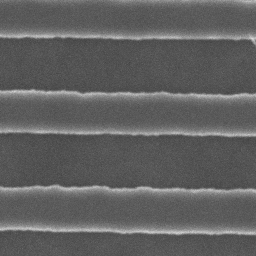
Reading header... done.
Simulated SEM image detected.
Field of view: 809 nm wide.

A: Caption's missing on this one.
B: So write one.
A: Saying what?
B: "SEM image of lines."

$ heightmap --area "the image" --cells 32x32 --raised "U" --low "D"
UUUUUUUUUUUUUUUUUUUUUUUUUUUUUUUU
UUUUUUUUUUUUUUUUUUUUUUUUUUUUUUUU
UUUUUUUUUUUUUUUUUUUUUUUUUUUUUUUU
UUUUUUUUUUUUUUUUUUUUUUUUUUUUUUUU
UUUUUUUUUUUUUUUUUUUUUUUUUUUUUUUU
DDDDDDDDDDDDDDDDDDDDDDDDDDDDDDDD
DDDDDDDDDDDDDDDDDDDDDDDDDDDDDDDD
DDDDDDDDDDDDDDDDDDDDDDDDDDDDDDDD
DDDDDDDDDDDDDDDDDDDDDDDDDDDDDDDD
DDDDDDDDDDDDDDDDDDDDDDDDDDDDDDDD
DDDDDDDDDDDDDDDDDDDDDDDDDDDDDDDD
UUUUUUUUUUDDDDDDDDDDUDDDDDDDDDDD
UUUUUUUUUUUUUUUUUUUUUUUUUUUUUUUU
UUUUUUUUUUUUUUUUUUUUUUUUUUUUUUUU
UUUUUUUUUUUUUUUUUUUUUUUUUUUUUUUU
UUUUUUUUUUUUUUUUUUUUUUUUUUUUUUUU
UDDDUUUUUUUUUUUUUUUUUUUUUUUUUUUU
DDDDDDDDDDDDDDDDDDDDDDDDDDDDDDDD
DDDDDDDDDDDDDDDDDDDDDDDDDDDDDDDD
DDDDDDDDDDDDDDDDDDDDDDDDDDDDDDDD
DDDDDDDDDDDDDDDDDDDDDDDDDDDDDDDD
DDDDDDDDDDDDDDDDDDDDDDDDDDDDDDDD
DDDDDDDDDDDDDDDDDDDDDDDDDDDDDDDD
UDDUUUUUDUUUUUDDDUUDDDDDDDDDDDDD
UUUUUUUUUUUUUUUUUUUUUUUUUUUUUUUU
UUUUUUUUUUUUUUUUUUUUUUUUUUUUUUUU
UUUUUUUUUUUUUUUUUUUUUUUUUUUUUUUU
UUUUUUUUUUUUUUUUUUUUUUUUUUUUUUUU
UUUUUUUUUUUUUUUUUUUUUUUUUUUUUUUU
DDDDDDDDDDDDDDDDDDDDDDDDDDDDDDDD
DDDDDDDDDDDDDDDDDDDDDDDDDDDDDDDD
DDDDDDDDDDDDDDDDDDDDDDDDDDDDDDDD